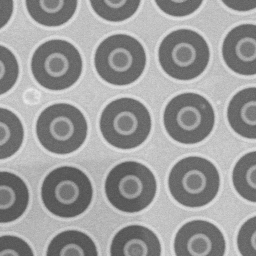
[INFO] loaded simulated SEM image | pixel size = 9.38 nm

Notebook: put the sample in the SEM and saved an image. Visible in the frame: an array of small figures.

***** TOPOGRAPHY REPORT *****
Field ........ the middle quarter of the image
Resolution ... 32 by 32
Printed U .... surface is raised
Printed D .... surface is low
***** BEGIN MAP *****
UDDDDUUDDDDDUUUUDDDDDUUUDDDDDDDD
DDDDDUUUDDDDDDDDDDDDUUUUDDDDDDDD
DDDDDUUUDDDDDDDDDDDDUUUUUDDDDDDD
DDDDUUUUUDDDDDDDDDDUUUUUUUUDDDDD
DDDUUUUUUUDDDDDDDDUUUUUUUUUUUUDU
DDUUUUUUUUUUDDDDUUUUUUUUUUUUUUUU
DUUUUUUUUUUUUUUUUUUUUUUUUUUUUUUU
UUUUUUUUUUUUUUUUUUUUUUUUUUUUDDDD
UUUUUUUUUUUUUDDDDDUUUUUUUUUDDDDD
DUUUUUUUUUUDDDDDDDDDUUUUUUDDDDDD
DDDUUUUUUUDDDDDDDDDDDUUUUDDDDDDD
DDDDUUUUUDDDDDDDDDDDDUUUUDDDDDUU
DDDDDUUUUDDDDDDDDDDDDDUUUDDDDUUU
DDDDDDUUUDDDDUUUUDDDDDUUDDDDDUUU
UDDDDDUUUDDDDUUUUUDDDDUUDDDDDUUU
UUDDDDUUDDDDDUUUUUDDDDUUUDDDDDUU
UUDDDDUUUDDDDUUUUDDDDDUUUDDDDDDD
UDDDDDUUUDDDDDDDDDDDDDUUUUDDDDDD
DDDDDDUUUUDDDDDDDDDDDUUUUUDDDDDD
DDDDDUUUUUDDDDDDDDDDDUUUUUUUDDDD
DDDDDUUUUUUUDDDDDDDUUUUUUUUUUUDU
DDDDUUUUUUUUUUDDDUUUUUUUUUUUUUUU
DDUUUUUUUUUUUUUUUUUUUUUUUUUUUUUU
UUUUUUUUUUUUUUUUUUUUUUUUUUUUUDDD
UUUUUUUUUUUUUUDDDDDUUUUUUUUUDDDD
DDDUUUUUUUUUDDDDDDDDDUUUUUUDDDDD
DDDDDUUUUUUDDDDDDDDDDDUUUUDDDDDD
DDDDDDUUUUUDDDDDDDDDDDDUUUDDDDDU
DDDDDDUUUUDDDDDDUDDDDDDUUUDDDDUU
DDDDDDDUUUDDDDDUUUUDDDDUUUDDDDUU
UUUDDDDUUUDDDDUUUUUDDDDDUUDDDDUU
UUUDDDDDUUDDDDUUUUUDDDDDUUDDDDDU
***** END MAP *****